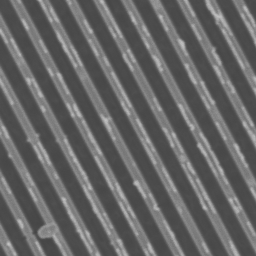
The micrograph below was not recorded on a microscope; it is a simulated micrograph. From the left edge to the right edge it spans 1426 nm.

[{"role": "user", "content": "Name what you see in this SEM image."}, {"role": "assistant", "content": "parallel lines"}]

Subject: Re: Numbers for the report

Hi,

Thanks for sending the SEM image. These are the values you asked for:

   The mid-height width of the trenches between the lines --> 74.4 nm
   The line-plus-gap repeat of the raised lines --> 0.137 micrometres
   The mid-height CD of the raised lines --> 63.3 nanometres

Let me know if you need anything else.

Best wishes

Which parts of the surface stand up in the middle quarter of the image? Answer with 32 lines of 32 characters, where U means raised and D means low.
DDUUUDDDDUUUDDDDUUUDDDDUUUDDDDUU
DDUUUUDDDUUUUDDDUUUUDDDUUUDDDDUU
DDDUUUDDDDUUUDDDDUUUDDDDUUUDDDDU
DDDDUUUDDDDUUUDDDDUUUDDDDUUDDDDU
DDDDUUUDDDDUUUDDDDUUUDDDDUUUDDDD
UDDDDUUUDDDDUUUDDDDUUUDDDDUUDDDD
UDDDDUUUDDDDUUUDDDDUUUDDDDUUUDDD
UUDDDDUUUDDDDUUUDDDDUUUDDDDUUUDD
UUDDDDUUUDDDDUUUDDDDUUUDDDDUUUDD
UUUDDDDUUUDDDDUUUDDDDUUUDDDDUUUD
UUUDDDDUUUDDDDUUUDDDDUUUDDDDUUUD
DUUUDDDDUUUDDDDUUUDDDDUUUDDDDUUU
DUUUDDDDUUUDDDDUUUDDDDUUUDDDDUUU
DDUUUDDDDUUUDDDDUUUDDDDUUUDDDDUU
DDDUUDDDDUUUDDDDUUUDDDDUUUUDDDUU
DDDUUUDDDDUUUDDDDUUUDDDDUUUDDDDU
DDDDUUUDDDUUUUDDDUUUUDDDUUUUDDDU
DDDDUUUDDDDUUUDDDDUUUDDDDUUUDDDD
UDDDDUUUDDDDUUUDDDDUUUDDDDUUUDDD
UDDDDUUUDDDDUUUDDDDUUUDDDDUUUDDD
UUDDDDUUUDDDDUUUDDDDUUUDDDDUUUDD
UUDDDDUUUDDDDUUUDDDDUUUDDDDUUUDD
UUUDDDDUUUDDDDUUUDDDDUUUDDDDUUUD
UUUDDDDUUUDDDDUUUDDDDUUUDDDDUUUD
DUUUDDDDUUUDDDDUUUDDDDUUUDDDDUUU
DUUUDDDDUUUDDDDUUUDDDDUUUDDDDUUU
DDUUUDDDDUUUDDDDUUUDDDDUUUDDDDUU
DDDUUDDDDDUUDDDDUUUDDDDUUUDDDDUU
DDDUUUDDDDUUUDDDDUUUDDDDUUUDDDDU
DDDDUUDDDDDUUDDDDUUUDDDDUUUDDDDU
DDDDUUUDDDDUUUDDDDUUUDDDDUUUDDDD
UDDDDUUUDDDDUUUDDDDUUUDDDUUUUDDD